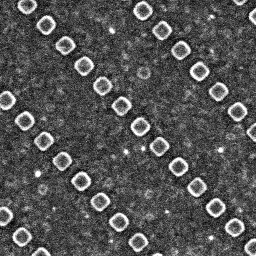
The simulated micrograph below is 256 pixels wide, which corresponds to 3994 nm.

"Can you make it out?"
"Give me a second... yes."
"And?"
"a regular array of raised bodies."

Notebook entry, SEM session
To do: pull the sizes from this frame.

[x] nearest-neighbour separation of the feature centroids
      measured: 0.43 microns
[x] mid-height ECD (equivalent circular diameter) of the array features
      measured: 259 nm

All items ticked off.